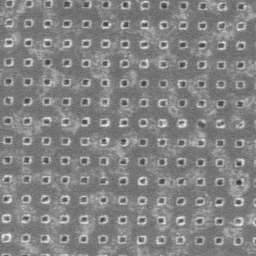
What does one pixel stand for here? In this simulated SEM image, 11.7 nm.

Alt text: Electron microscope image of a regular array of raised bodies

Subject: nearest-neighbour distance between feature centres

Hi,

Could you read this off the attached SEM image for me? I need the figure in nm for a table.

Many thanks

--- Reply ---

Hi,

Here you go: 222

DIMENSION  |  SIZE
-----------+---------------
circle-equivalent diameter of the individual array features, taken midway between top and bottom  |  0.0933 um